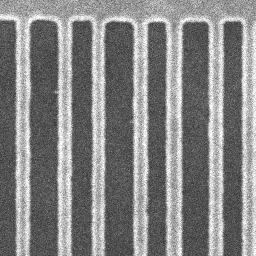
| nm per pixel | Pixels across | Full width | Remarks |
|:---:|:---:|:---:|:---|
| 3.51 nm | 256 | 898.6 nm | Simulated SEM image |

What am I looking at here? parallel lines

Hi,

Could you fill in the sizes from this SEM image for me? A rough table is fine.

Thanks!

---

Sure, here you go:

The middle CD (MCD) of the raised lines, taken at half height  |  39.1 nanometers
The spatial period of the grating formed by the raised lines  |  0.135 um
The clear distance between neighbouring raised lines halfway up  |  84.3 nm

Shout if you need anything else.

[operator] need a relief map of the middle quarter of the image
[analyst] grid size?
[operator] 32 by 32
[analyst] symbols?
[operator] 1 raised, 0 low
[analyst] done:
11000001110000000011000000111000
11000001110000000011100000111000
11000001110000000011100000111000
11000000110000000011000000111000
10000000110000000011000000111000
11000001110000000011000000111000
11000001110000000011000000111000
11000001110000000011000000111000
11000001110000000011000000111000
10000000110000000011000000111000
10000001110000000011000000111000
10000001110000000011000000111000
10000001110000000011100000111000
11000001110000000011100000111000
11000000110000000111100000111000
11000000110000000011000000111000
11000000110000000011000000111000
11000000110000000011100000111000
11000000110000000011100000111000
11000000110000000011000000111000
11000000110000000011000000111000
10000000110000000011000000111000
11000000110000000011000000111000
10000000110000000011100000111000
10000001110000000011100000111000
11000001110000000011100000111000
11000001110000000011100000111000
11000001110000000011100000111000
10000001110000000011000000111000
10000001110000000011000000111000
10000001110000000011000000111000
10000001110000000011000000111000